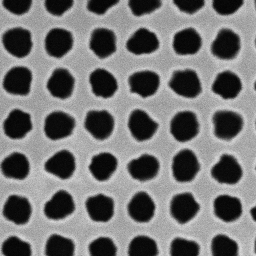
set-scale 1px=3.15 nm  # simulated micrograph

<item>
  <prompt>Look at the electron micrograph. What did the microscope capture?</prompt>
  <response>a regular array of holes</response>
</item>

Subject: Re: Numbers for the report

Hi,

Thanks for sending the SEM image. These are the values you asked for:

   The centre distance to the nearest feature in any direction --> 126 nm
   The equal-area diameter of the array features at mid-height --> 87.1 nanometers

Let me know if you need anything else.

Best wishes